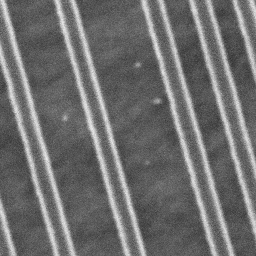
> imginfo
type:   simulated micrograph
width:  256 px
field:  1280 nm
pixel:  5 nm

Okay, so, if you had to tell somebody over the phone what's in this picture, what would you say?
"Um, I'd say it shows lines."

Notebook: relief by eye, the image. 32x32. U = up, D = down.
UDDDDDDUUDDDDDDDDDUUDDDDUUDDDUUU
UDDDDDDUUUDDDDDDDDUUUDDDUUUDDDUU
UDDDDDDDUUDDDDDDDDUUUDDDDUUDDDUU
UDDDDDDDUUDDDDDDDDDUUDDDDUUDDDUU
UUDDDDDDUUDDDDDDDDDUUDDDDUUDDDDU
UUDDDDDDUUUDDDDDDDDUUUDDDUUUDDDU
UUDDDDDDDUUDDDDDDDDDUUDDDDUUDDDU
UUUDDDDDDUUDDDDDDDDDUUDDDDUUDDDU
UUUDDDDDDUUUDDDDDDDDUUUDDDUUUDDD
DUUDDDDDDDUUDDDDDDDDUUUDDDUUUDDD
DUUDDDDDDDUUDDDDDDDDDUUDDDDUUDDD
DUUUDDDDDDUUDDDDDDDDDUUDDDDUUDDD
DUUUDDDDDDUUUDDDDDDDDUUUDDDUUUDD
DDUUDDDDDDDUUDDDDDDDDDUUDDDDUUDD
DDUUDDDDDDDUUDDDDDDDDDUUDDDDUUDD
DDUUUDDDDDDUUUDDDDDDDDUUUDDDUUDD
DDDUUDDDDDDDUUDDDDDDDDUUUDDDUUUD
DDDUUDDDDDDDUUDDDDDDDDDUUDDDDUUD
DDDUUUDDDDDDUUDDDDDDDDDUUDDDDUUD
DDDUUUDDDDDDUUUDDDDDDDDUUUDDDUUU
DDDDUUDDDDDDDUUDDDDDDDDUUUDDDUUU
DDDDUUDDDDDDDUUDDDDDDDDDUUDDDDUU
DDDDUUUDDDDDDUUUDDDDDDDDUUDDDDUU
DDDDDUUDDDDDDUUUDDDDDDDDUUUDDDUU
DDDDDUUDDDDDDDUUDDDDDDDDDUUDDDDU
DDDDDUUUDDDDDDUUDDDDDDDDDUUDDDDU
DDDDDUUUDDDDDDUUUDDDDDDDDUUUDDDU
UDDDDDUUDDDDDDDUUDDDDDDDDUUUDDDU
UDDDDDUUDDDDDDDUUDDDDDDDDDUUDDDD
UDDDDDUUUDDDDDDUUDDDDDDDDDUUDDDD
UDDDDDDUUDDDDDDUUUDDDDDDDDUUUDDD
UUDDDDDUUDDDDDDDUUDDDDDDDDDUUDDD